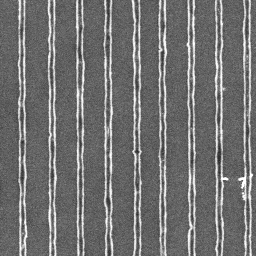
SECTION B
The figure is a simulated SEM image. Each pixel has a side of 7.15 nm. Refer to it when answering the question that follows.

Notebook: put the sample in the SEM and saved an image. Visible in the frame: parallel lines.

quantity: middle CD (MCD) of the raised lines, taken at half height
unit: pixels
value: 5.24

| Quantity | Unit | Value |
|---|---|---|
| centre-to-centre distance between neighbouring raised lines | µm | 0.201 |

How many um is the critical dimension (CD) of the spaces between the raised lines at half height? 0.161